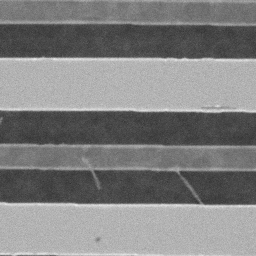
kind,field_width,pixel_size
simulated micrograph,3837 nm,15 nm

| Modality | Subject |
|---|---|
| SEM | lines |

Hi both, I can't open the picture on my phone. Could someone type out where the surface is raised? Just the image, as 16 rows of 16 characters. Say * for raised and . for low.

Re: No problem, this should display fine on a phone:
****************
........********
................
................
****************
****************
****************
................
................
****************
****************
................
................
****************
****************
****************